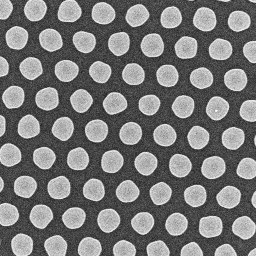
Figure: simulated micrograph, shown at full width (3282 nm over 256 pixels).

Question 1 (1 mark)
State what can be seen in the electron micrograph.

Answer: an array of small figures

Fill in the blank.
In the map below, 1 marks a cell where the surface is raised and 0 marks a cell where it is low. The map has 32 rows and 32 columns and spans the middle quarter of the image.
11100001111000001110000001100000
11110011111100011111000011110000
11100011111100011111000111110000
11000001111000011111000111110000
00000000110000001111000011110000
00000000000000000000000001100000
00001000000000000000000000000000
00111100000111000000000000000000
00111110001111100001111000001111
00111110001111110001111100001111
00111110001111110001111100011111
00011100001111100001111000011111
00000000000100000000110000001111
10000000000000000000000000000000
11000001110000000000000000000000
11000011111000011110000011000000
11000111111000111110000111100000
11000111111000111110000111110001
10000011110000111110000111110001
00000000000000011100000111110001
00000000000000000000000001000000
00111000000000000000000000000000
01111100001111000001110000000000
01111100001111100011111000011110
01111100011111100011111000111111
01111100001111000011111000111111
00000000001111000011110000011111
00000000000000000001110000011110
00000000000000000000000000000000
10000011100000011000000000000000
10000111110000111100001111000000
10000111110001111110001111100011